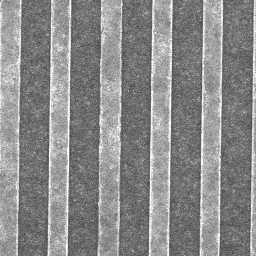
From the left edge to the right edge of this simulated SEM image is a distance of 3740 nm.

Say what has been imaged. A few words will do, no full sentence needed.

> parallel lines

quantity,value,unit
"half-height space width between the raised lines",460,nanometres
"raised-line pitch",739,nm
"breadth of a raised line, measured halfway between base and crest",266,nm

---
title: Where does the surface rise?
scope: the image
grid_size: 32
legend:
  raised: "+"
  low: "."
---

+++....++....++....++.....++....
+++....++....++....++.....++....
++.....++....++....++.....++....
++.....++....++....++.....++....
++.....++....++....++.....++....
++.....++....++....++....+++....
++....+++....++....++....+++....
++....+++....++....++....+++....
++....+++....++....++....+++....
++....+++....++....++....+++....
++....+++....++....++....+++....
++....+++....++....++....+++....
++....+++....++....++....+++....
++....+++....++....++....+++....
++....+++....++....++....+++....
++....+++....++....++....+++....
++....+++....++....++....++.....
++....++.....++....++....++.....
++....++.....++....++....++.....
++....++.....++....++....++.....
++....++.....++....++....++.....
++....++....+++....++....++.....
++....++....+++....++....++.....
++....++....+++....++....++.....
++....++....+++....++....++.....
++....++....+++....++....++.....
++....++....+++....++....++.....
++....++....+++....++....++.....
++....++....+++....++....++....+
++....++....+++....++....++....+
++....++....+++....++....++....+
++....++....+++....++....++....+